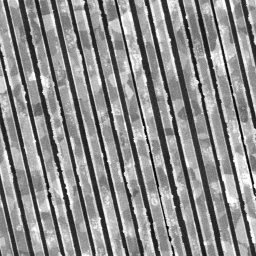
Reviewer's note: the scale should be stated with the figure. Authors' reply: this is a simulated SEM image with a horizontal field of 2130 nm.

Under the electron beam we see parallel lines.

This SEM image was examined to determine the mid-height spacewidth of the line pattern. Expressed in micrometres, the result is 0.0426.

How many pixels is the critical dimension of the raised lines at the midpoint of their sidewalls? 10.4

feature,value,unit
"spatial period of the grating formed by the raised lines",128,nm